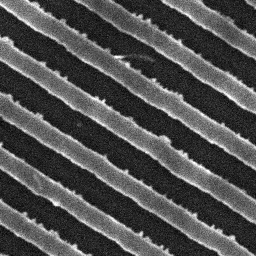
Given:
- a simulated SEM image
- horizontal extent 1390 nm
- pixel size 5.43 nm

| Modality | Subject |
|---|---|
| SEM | lines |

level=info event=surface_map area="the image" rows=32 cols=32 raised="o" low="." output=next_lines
oooo......ooooo......oooo......o
.ooooo......oooo.......oooo.....
...oooo......ooooo......ooooo...
....ooooo......oooo......ooooo..
......ooooo......oooo......ooooo
oo......oooo......ooooo......ooo
ooo......ooooo......oooo......oo
oooo......ooooo......ooooo......
.ooooo......oooo.......oooo.....
...oooo.......oooo......ooooo...
.....oooo......ooooo......oooo..
......ooooo.....ooooo.......oooo
oo......ooooo.....ooooo......ooo
ooo......ooooo......oooo......oo
ooooo......oooo......ooooo......
.ooooo.......oooo......oooo.....
...ooooo......ooooo.....ooooo...
.....oooo.......ooooo.....ooooo.
......ooooo......ooooo......oooo
oo......ooooo......oooo......ooo
ooo.......oooo......ooooo......o
.oooo......ooooo.....ooooo......
..oooo.......oooo......ooooo....
....oooo......ooooo......ooooo..
.....ooooo......oooo.......oooo.
o......oooo......ooooo......oooo
oo.......oooo......oooo.......oo
oooo......oooo......ooooo......o
.oooo......ooooo......oooo......
..ooooo......ooooo.....ooooo....
....ooooo......oooo......ooooo..
......oooo......ooooo......oooo.